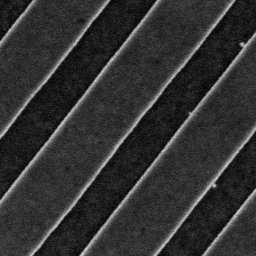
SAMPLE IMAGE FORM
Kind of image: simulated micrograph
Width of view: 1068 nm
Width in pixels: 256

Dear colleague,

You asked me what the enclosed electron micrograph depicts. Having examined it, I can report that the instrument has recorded lines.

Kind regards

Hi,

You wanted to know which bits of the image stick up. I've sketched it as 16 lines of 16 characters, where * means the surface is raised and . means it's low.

..****...*****..
.*****...*****..
*****...*****...
****...*****...*
***...*****...**
***...****...***
**...*****..****
*...*****...****
...*****...*****
..*****...*****.
..****...*****..
.*****..*****...
*****...****...*
****...*****...*
***...*****...**
**...*****...***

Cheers